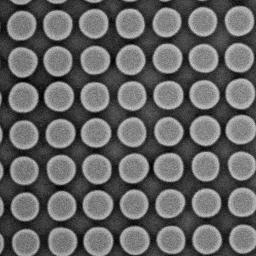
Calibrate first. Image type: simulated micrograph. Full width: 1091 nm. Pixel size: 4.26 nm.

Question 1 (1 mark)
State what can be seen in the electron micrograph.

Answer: an array of small figures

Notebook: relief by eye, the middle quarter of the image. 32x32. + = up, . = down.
++...++++++..+++++++...++++++...
+....+++++....+++++.....++++....
................++..............
................................
.........................++.....
+....+++++....++++++...++++++...
++...++++++...++++++...+++++++..
++..+++++++...++++++...+++++++.+
++..+++++++...++++++...+++++++..
++..+++++++...++++++...++++++...
++...++++++...++++++....+++++...
......+++.......................
................................
.........................++.....
+.....++++.....++++....+++++....
++...++++++...++++++...++++++...
+++.++++++++..++++++...+++++++..
+++.++++++++..++++++...+++++++..
+++..++++++...++++++...++++++...
++...++++++....+++++....+++++...
+......+++......++..............
................................
..........................++....
+.....++++.....+++++...++++++...
++...++++++...+++++++..+++++++..
+++..+++++++..+++++++..+++++++..
+++..+++++++..+++++++..+++++++..
+++..+++++++..+++++++..++++++...
++....+++++...++++++....+++++...
+......+++......++..............
................................
..........................++....